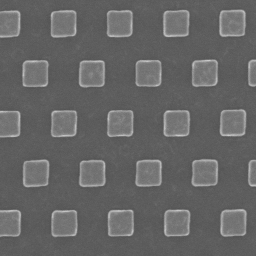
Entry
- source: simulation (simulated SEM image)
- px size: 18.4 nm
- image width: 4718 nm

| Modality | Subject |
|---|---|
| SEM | a regular array of raised bodies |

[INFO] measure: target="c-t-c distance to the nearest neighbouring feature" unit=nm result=1040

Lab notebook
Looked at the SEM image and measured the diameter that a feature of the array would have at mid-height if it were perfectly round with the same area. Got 0.522 micrometres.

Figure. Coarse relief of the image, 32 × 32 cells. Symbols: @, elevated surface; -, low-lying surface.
--------------------------------
-@-----@@-----@@-----@@-----@@--
@@----@@@----@@@-----@@@----@@@-
@@----@@@----@@@-----@@@----@@@-
@@-----@------@------@@-----@---
--------------------------------
--------------------------------
--------------------------------
---@@@----@@@----@@@----@@@----@
---@@@----@@@----@@@----@@@----@
---@@@----@@@----@@@----@@@----@
--------------------------------
--------------------------------
--------------------------------
@@----@@@@----@@@----@@@----@@@-
@@----@@@@----@@@----@@@----@@@-
@@----@@@@----@@@----@@@----@@--
--------------------------------
--------------------------------
--------------------------------
---@@@----@@@----@@@----@@@----@
---@@@----@@@----@@@----@@@----@
---@@@----@@@----@@@----@@@----@
--------------------------------
--------------------------------
--------------------------------
@@-----@@-----@@-----@@-----@@@-
@@@----@@@----@@@----@@@----@@@-
@@-----@@@----@@@----@@@----@@@-
--------------------------------
--------------------------------
--------------------------------